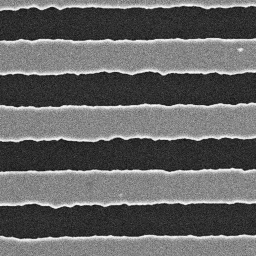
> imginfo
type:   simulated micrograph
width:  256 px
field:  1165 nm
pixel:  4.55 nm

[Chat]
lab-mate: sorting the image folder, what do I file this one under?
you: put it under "lines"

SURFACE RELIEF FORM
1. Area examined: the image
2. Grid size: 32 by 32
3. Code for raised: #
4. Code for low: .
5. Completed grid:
################################
................................
................................
................................
................................
################################
################################
################################
################################
................................
................................
................................
................................
################################
################################
################################
################################
###.###.######.....#.#..#.......
................................
................................
................................
################################
################################
################################
################################
####.##########.###.............
................................
................................
................................
.............#....###..#..##.###
################################
################################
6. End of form